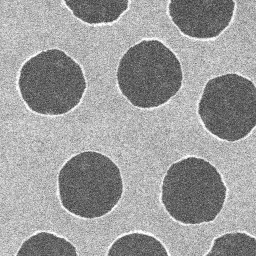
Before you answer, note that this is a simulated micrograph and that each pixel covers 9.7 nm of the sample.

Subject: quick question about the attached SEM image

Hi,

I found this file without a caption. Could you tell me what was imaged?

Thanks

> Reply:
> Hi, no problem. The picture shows holes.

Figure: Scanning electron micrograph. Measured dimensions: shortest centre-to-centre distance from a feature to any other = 101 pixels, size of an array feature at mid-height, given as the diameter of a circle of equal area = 646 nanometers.